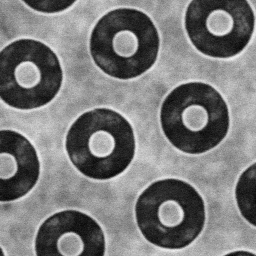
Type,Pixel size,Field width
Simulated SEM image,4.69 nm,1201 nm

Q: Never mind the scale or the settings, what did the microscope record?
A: ring-shaped grooves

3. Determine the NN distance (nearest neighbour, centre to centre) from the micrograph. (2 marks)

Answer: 0.46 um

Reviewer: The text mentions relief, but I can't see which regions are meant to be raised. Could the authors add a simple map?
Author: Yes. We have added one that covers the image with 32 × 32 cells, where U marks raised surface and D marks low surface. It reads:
UUUDDDDDDUUUUUUUUUUUUUUUDDDDDDDU
UUUUUDDUUUUUUUDDDDUUUUUDDDDUDDDD
UUUUUUUUUUUUDDDDDDDUUUUDDDUUUDDD
UUUUUUUUUUUUDDDDDDDUUUUDDDUUUDDD
UUUUUUUUUUUDDDUUUDDDUUUDDDDDDDDU
UDDDDDUUUUUDDDUUUDDDUUUUDDDDDDDU
DDDDDDDUUUUDDDUUUDDDUUUUUDDDDDUU
DDDDDDDUUUUUDDDDDDDDUUUUUUUUUUUU
DDUUUDDDUUUUDDDDDDDUUUUUUUUUUUUU
DDUUUDDDUUUUUUDDDUUUUUUUUUUUUUUU
DDUUUDDDUUUUUUUUUUUUUUUDDDUUUUUU
DDDDDDDUUUUUUUUUUUUUUDDDDDDUUUUU
DDDDDDUUUUUUUUUUUUUUDDDDDDDDUUUU
UUDDUUUUUUUUDUUUUUUUDDDUUDDDUUUU
UUUUUUUUUUDDDDDUUUUUDDDUUUDDDUUU
UUUUUUUUUDDDDDDDUUUUDDDUUUDDDUUU
DDUUUUUUDDDDUDDDDUUUDDDDDDDDUUUU
DDDUUUUUDDDUUUDDDUUUUDDDDDDDUUUU
DDDDUUUUDDDUUUDDDUUUUUDDDDDUUUUU
UUDDDUUUUDDDUDDDDUUUUUUUUUUUUUUU
UUDDDUUUUDDDDDDDUUUUUUUUUUUUUUUU
UUDDDUUUUUDDDDDUUUUUUUUUUUUUUUDD
DDDDDUUUUUUUUUUUUUUUDDUUUUUUUUDD
DDDDUUUUUUUUUUUUUUDDDDDDUUUUUDDD
DDDUUUUUUUUUUUUUUDDDDDDDDUUUUDDD
UUUUUUUUUUUUUUUUUDDDUUDDDUUUUUDD
UUUUUUUDDDUUUUUUUDDDUUUDDDUUUUDD
UUUUUUDDDDDDUUUUUDDDUUUDDDUUUUUD
UUUUUDDDDDDDDUUUUDDDDDDDDUUUUUUU
UUUUUDDDUUDDDUUUUUDDDDDDDUUUUUUU
UUUUDDDUUUDDDUUUUUUDDDDDUUUUUUUU
UUUUDDDUUUDDDUUUUUUUUUUUUUUUUDDU